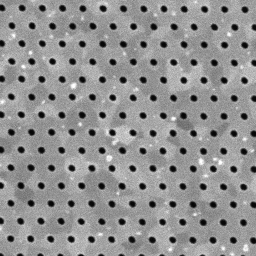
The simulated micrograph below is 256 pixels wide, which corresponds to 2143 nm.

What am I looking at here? a regular array of holes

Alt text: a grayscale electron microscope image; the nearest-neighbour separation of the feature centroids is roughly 168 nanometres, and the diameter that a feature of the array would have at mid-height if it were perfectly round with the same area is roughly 57.4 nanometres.